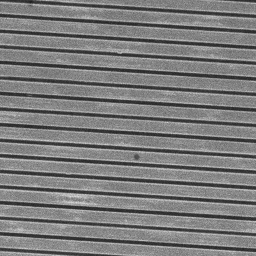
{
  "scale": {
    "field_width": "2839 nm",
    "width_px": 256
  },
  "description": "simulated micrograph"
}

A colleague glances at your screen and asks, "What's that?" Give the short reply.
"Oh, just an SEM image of parallel lines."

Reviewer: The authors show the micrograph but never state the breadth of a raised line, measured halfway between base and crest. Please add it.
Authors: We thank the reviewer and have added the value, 122 nm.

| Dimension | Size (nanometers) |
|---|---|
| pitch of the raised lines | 172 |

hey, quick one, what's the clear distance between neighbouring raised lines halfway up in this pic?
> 44.3 nanometres